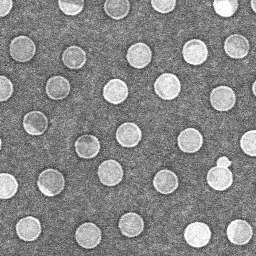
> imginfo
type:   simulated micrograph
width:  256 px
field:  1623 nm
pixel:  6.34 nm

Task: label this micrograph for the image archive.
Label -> a regular array of raised bodies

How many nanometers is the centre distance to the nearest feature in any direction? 268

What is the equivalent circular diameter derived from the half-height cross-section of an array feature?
154 nanometers